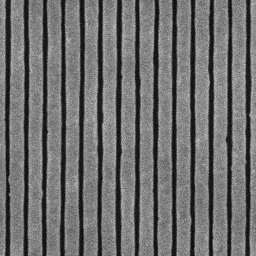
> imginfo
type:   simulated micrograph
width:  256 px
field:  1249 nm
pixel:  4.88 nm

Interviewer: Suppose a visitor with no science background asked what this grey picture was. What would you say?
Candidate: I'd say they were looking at parallel lines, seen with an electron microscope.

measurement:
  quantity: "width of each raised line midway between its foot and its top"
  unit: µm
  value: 0.0665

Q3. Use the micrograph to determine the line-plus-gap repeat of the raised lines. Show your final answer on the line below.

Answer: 0.0902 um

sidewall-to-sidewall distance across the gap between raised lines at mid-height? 22 nanometers